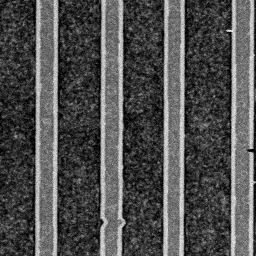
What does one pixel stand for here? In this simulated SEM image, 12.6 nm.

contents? one or a few lines or trenches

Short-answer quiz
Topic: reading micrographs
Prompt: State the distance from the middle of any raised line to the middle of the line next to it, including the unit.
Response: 824 nanometres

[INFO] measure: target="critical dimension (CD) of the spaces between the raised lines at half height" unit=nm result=595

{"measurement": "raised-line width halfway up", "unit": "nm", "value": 227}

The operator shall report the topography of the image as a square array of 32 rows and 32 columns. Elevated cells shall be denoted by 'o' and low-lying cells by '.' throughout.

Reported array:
.....oo......oo......oo......ooo
.....oo......oo......oo......ooo
.....oo......oo......oo......ooo
.....oo......oo......oo......oo.
.....oo......oo......oo......oo.
.....oo......oo......oo......oo.
.....oo......oo......oo......ooo
.....oo......oo......oo......oo.
.....oo......oo......oo......oo.
.....oo......oo......oo......oo.
.....oo......oo......oo......oo.
.....oo......oo......oo......oo.
.....oo......oo......oo......oo.
.....oo......oo......oo......oo.
.....oo......oo......oo......oo.
.....oo......oo......oo......oo.
.....oo......oo......oo......oo.
.....oo......oo......oo......oo.
.....oo......oo......oo......oo.
.....oo......oo......oo......oo.
.....oo......oo......oo......oo.
.....oo......oo......oo......oo.
.....oo......oo......oo......oo.
.....oo......oo......oo......oo.
.....oo......oo......oo......oo.
.....oo......oo......oo......oo.
.....oo......oo......oo......oo.
.....oo......oo......oo......oo.
.....oo......oo......oo......oo.
.....oo......oo......oo......oo.
.....oo......oo......oo......oo.
.....oo......oo......oo......oo.